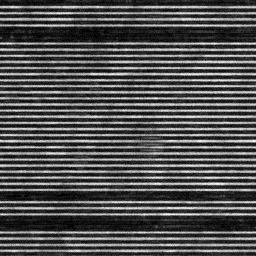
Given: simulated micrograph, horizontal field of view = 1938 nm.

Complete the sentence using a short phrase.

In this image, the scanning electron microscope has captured parallel lines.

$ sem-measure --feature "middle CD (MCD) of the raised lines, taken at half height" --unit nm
11.4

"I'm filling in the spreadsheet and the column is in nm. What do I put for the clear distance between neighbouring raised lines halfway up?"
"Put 33.1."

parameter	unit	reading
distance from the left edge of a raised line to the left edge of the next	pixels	6.09